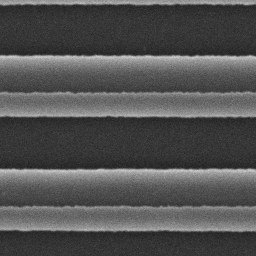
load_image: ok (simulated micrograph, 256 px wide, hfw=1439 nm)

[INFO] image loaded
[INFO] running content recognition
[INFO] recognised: lines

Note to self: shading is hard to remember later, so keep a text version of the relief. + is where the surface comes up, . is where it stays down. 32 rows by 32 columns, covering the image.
+.+..............++.++....+...++
................................
................................
................................
................................
................................
................................
++++++++++++++++++++++++++++++++
++++++++++++++++++++++++++++++++
++++++++++++++++++++++++++++++++
++++++++++++++++++++++++++++++++
++++++++++++++++++++++++++++++++
++++++++++++++++++++++++++++++++
++++++++++++++++++++++++++++++++
+++++++++++++.++++++++++++++++++
................................
................................
................................
................................
................................
................................
++++++++++++++++++++++++++++++++
++++++++++++++++++++++++++++++++
++++++++++++++++++++++++++++++++
++++++++++++++++++++++++++++++++
++++++++++++++++++++++++++++++++
++++++++++++++++++++++++++++++++
++++++++++++++++++++++++++++++++
++++++++++++++++++++++++++++++++
................................
................................
................................